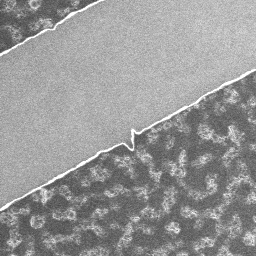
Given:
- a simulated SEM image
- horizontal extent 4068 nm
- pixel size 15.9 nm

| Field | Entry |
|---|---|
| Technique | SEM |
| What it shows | one or a few lines or trenches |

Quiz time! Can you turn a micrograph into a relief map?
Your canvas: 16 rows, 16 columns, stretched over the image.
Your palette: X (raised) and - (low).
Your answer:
XXXXX-----------
XXXX------------
XX--------------
----------------
----------------
--------------XX
------------XXXX
----------XXXXXX
--------XXXXXXXX
------XXXXXXXXXX
-----XXXXXXXXXXX
---XXXXXXXXXXXXX
-XXXXXXXXXXXXXXX
XXXXXXXXXXXXXXXX
XXXXXXXXXXXXXXXX
XXXXXXXXXXXXXXXX